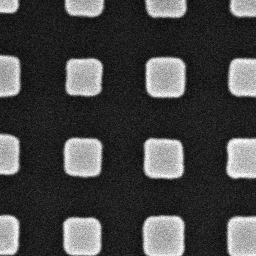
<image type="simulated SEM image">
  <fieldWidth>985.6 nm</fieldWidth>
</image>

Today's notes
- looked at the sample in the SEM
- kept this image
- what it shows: raised bodies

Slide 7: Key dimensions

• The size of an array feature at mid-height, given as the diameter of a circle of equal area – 155 nm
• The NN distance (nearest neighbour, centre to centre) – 308 nm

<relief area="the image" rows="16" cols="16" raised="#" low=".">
#...##...###..##
................
................
................
#...##...##...##
#...##...##...##
................
................
#...............
#...##...##...##
#...##...##...##
................
................
................
#...##...##...##
#...##...##...##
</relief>